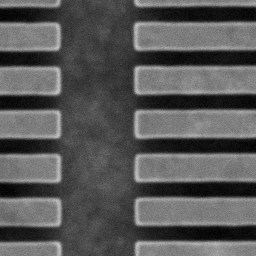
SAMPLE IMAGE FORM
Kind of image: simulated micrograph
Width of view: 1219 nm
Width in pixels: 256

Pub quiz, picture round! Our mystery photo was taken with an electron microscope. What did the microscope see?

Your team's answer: groups of lines, slits or small figures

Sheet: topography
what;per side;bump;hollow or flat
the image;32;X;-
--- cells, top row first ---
XXXXXXX----------XXXXXXXXXXXXXXX
--------------------------------
--------------------------------
XXXXXXX----------XXXXXXXXXXXXXXX
XXXXXXX----------XXXXXXXXXXXXXXX
XXXXXXX----------XXXXXXXXXXXXXXX
--------------------------------
--------------------------------
XXXXXXX----------XXXXXXXXXXXXXXX
XXXXXXX----------XXXXXXXXXXXXXXX
XXXXXXX----------XXXXXXXXXXXXXXX
XXXXXXX----------XXXXXXXXXXXXXXX
--------------------------------
--------------------------------
XXXXXXX----------XXXXXXXXXXXXXXX
XXXXXXX----------XXXXXXXXXXXXXXX
XXXXXXX----------XXXXXXXXXXXXXXX
--------------------------------
--------------------------------
XXXXXXX----------XXXXXXXXXXXXXXX
XXXXXXX----------XXXXXXXXXXXXXXX
XXXXXXX----------XXXXXXXXXXXXXXX
XXXXXXX----------XXXXXXXXXXXXXXX
--------------------------------
--------------------------------
XXXXXXX----------XXXXXXXXXXXXXXX
XXXXXXX----------XXXXXXXXXXXXXXX
XXXXXXX----------XXXXXXXXXXXXXXX
--------------------------------
--------------------------------
XXXXXXX----------XXXXXXXXXXXXXXX
XXXXXXX----------XXXXXXXXXXXXXXX